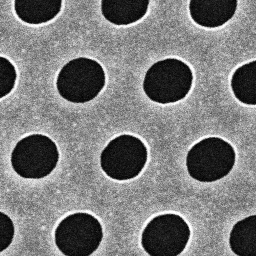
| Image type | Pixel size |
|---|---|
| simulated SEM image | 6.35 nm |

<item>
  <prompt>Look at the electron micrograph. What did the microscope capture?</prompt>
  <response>holes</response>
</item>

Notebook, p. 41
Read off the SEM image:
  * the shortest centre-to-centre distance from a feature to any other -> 553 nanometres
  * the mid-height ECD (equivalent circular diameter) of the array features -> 297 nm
